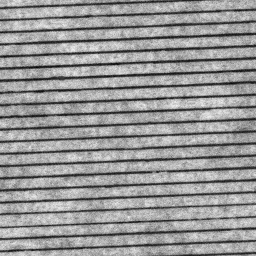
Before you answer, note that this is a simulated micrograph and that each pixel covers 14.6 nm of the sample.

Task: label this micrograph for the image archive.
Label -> parallel lines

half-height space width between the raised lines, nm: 51.2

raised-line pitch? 0.178 micrometres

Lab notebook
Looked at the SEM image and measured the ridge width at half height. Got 128 nm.